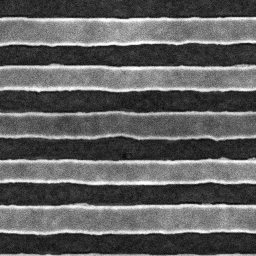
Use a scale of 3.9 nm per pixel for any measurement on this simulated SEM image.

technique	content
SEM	lines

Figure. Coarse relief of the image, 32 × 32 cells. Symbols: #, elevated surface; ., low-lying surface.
................................
................................
################################
################################
################################
##################...##....##...
................................
................................
################################
################################
################################
................................
................................
................................
################################
################################
################################
................................
................................
................................
################################
################################
################################
................................
................................
................................
################################
################################
################################
................................
................................
................................